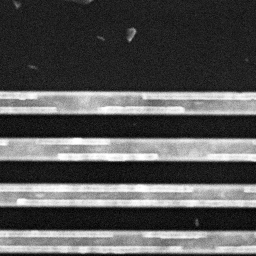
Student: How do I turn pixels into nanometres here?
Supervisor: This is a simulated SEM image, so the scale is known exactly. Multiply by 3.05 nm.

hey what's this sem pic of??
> parallel lines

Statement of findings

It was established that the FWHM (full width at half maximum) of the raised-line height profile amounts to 63.7 nanometres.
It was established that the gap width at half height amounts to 25.4 pixels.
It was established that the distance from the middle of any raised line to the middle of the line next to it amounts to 141 nm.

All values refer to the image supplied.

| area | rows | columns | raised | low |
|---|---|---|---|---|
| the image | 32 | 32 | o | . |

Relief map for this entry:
................................
................................
................................
................................
................................
................................
................................
................................
................................
................................
................................
................................
oooooooooooooooooooooooooooooooo
oooooooooooooooooooooooooooooooo
................................
................................
................................
ooooooooooooooooooooooooooooo...
oooooooooooooooooooooooooooooooo
oooooooooooooooooooooooooooooooo
................................
................................
................................
oooooooooooooooooooooooooooooooo
oooooooooooooooooooooooooooooooo
oooooooooooooooooooooooooooooooo
................................
................................
................................
oooooooooooooooooooooooooooooooo
oooooooooooooooooooooooooooooooo
.........ooooooooooo.o..........